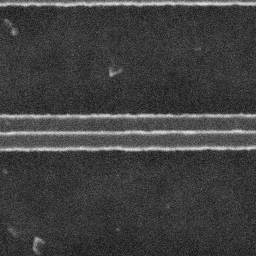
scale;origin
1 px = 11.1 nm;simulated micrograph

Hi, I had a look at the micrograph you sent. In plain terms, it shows lines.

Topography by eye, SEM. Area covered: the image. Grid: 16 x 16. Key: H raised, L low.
LLLLLLLLLLLLLLLL
LLLLLLLLLLLLLLLL
LLLLLLLLLLLLLLLL
LLLLLLLLLLLLLLLL
LLLLLLLLLLLLLLLL
LLLLLLLLLLLLLLLL
LLLLLLLLLLLLLLLL
HHHHHHHHHHHHHHHH
HHHHHHHHHHHHHHHH
LLLLLLLLLLLLLLLL
LLLLLLLLLLLLLLLL
LLLLLLLLLLLLLLLL
LLLLLLLLLLLLLLLL
LLLLLLLLLLLLLLLL
LLLLLLLLLLLLLLLL
LLLLLLLLLLLLLLLL